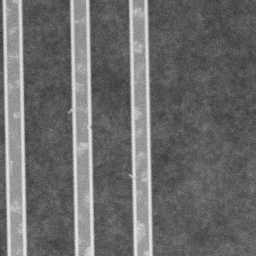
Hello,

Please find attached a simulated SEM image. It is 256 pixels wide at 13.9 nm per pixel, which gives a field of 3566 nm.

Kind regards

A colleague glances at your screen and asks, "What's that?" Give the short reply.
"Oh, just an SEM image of one or a few lines or trenches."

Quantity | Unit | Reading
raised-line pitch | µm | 0.878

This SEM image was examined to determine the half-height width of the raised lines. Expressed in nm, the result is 214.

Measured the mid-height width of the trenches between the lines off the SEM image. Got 666 nm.